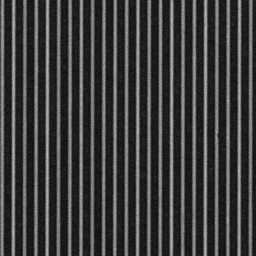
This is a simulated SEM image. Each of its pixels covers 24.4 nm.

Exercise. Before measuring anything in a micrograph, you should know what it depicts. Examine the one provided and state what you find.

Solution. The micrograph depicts parallel lines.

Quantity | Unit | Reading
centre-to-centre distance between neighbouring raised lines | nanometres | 276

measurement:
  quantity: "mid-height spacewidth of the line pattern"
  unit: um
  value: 0.223